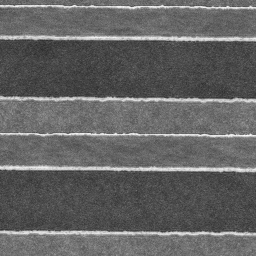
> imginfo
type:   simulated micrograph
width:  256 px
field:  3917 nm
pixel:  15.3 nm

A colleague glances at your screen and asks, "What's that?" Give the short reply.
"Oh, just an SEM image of lines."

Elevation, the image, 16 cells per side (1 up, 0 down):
1111111111111111
1111111111111111
0000000000000000
0000000000000000
0000000000000000
0000000000000000
1111111111111111
1111111111111111
1111111111111111
1111111111111111
0000000011111111
0000000000000000
0000000000000000
0000000000000000
0000000000000000
1111111111111111